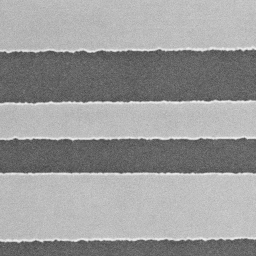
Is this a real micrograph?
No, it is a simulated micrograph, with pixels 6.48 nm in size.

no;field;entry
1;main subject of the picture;lines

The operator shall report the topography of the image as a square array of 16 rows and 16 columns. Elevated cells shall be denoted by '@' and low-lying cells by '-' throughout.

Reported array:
@@@@@@@@@@@@@@@@
@@@@@@@@@@@@@@@@
@@@@@@@@@@@@@@@@
----------------
----------------
----------------
@@@@@@@@@@@@@@@@
@@@@@@@@@@@@@@@@
@@@@@@@@@@@@@@@@
----------------
----------------
@@@@@@@@@@@@@@@@
@@@@@@@@@@@@@@@@
@@@@@@@@@@@@@@@@
@@@@@@@@@@@@@@@@
----------------